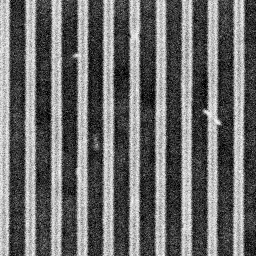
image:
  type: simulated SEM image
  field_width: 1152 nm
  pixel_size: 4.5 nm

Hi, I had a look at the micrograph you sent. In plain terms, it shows parallel lines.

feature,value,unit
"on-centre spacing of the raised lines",117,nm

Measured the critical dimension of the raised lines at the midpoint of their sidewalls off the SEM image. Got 0.0382 microns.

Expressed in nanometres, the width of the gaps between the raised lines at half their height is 76.4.